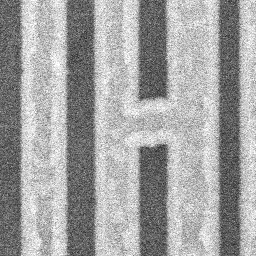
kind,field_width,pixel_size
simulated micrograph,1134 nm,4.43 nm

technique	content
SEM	one or a few lines or trenches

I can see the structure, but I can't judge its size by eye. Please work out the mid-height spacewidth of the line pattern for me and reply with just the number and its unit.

165 nanometers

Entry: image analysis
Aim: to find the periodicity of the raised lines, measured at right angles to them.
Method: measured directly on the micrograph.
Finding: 331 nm